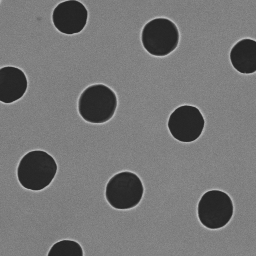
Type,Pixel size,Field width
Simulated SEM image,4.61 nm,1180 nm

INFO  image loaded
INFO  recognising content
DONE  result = holes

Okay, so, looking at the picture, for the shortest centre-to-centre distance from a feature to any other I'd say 416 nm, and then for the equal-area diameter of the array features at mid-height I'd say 169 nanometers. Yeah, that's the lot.